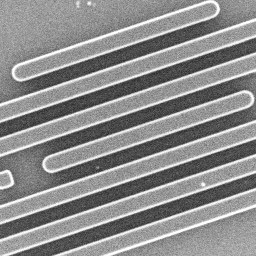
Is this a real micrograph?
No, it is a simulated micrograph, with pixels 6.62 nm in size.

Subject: groups of lines, slits or small figures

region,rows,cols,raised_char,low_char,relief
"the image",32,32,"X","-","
-------------------------XX-----
----------------------XXXXX-----
-------------------XXXXXXX------
----------------XXXXXXX------XXX
-------------XXXXXXX------XXXXXX
----------XXXXXXX------XXXXXX---
-------XXXXXXX------XXXXXX------
----XXXXXXX------XXXXXX------XXX
--XXXXXX------XXXXXX------XXXXXX
--XXX------XXXXXX------XXXXXXX--
--------XXXXXX------XXXXXXX-----
-----XXXXXX------XXXXXXX------X-
--XXXXXXX------XXXXXX------XXXXX
XXXXX------XXXXXXX------XXXXXXX-
XX------XXXXXXX------XXXXXXX----
------XXXXXX------XXXXXXX------X
--XXXXXXX------XXXXXXX------XXXX
XXXXXX------XXXXXXX------XXXXXXX
XXX------XXXXXXX------XXXXXXX---
------XXXXXXX------XXXXXX------X
-----XXXXX------XXXXXXX------XXX
X------------XXXXXX-------XXXXXX
XX--------XXXXXX------XXXXXXX---
X------XXXXXXX------XXXXXX------
----XXXXXX------XXXXXXX------XXX
-XXXXXX------XXXXXXX------XXXXXX
XXXXX------XXXXXX------XXXXXXX--
X------XXXXXXX------XXXXXXX-----
----XXXXXXX------XXXXXXX--------
--XXXXXX------XXXXXXX-----------
XXXXX------XXXXXXX--------------
XX------XXXXXXX-----------------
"